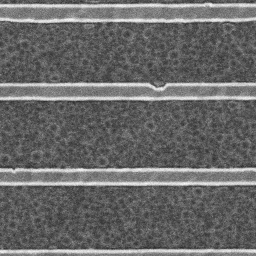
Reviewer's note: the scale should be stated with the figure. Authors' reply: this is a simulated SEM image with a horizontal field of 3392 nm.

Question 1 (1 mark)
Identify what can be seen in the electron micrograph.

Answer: one or a few lines or trenches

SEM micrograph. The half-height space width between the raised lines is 0.892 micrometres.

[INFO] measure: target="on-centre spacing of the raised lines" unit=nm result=1090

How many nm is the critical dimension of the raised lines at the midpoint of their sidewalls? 187